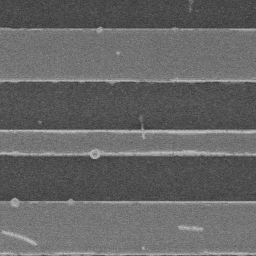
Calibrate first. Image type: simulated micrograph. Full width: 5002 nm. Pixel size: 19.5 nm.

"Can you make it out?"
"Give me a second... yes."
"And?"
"lines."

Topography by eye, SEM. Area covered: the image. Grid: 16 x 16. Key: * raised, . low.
................
................
****************
****************
****************
................
................
................
****************
****************
................
................
................
****************
****************
****************